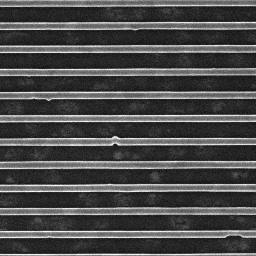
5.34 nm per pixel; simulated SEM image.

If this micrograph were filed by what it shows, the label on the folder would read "parallel lines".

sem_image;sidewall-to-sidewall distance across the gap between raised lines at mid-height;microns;0.0875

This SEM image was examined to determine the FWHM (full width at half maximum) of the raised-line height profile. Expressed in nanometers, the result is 34.1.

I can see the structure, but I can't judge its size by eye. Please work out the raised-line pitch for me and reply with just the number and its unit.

124 nanometers